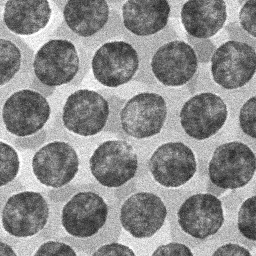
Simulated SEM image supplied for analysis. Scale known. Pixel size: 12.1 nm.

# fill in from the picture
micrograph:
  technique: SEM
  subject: a regular array of holes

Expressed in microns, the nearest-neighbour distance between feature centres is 0.699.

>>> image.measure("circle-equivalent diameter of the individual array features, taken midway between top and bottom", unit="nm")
569